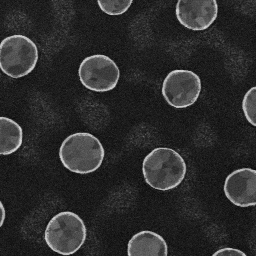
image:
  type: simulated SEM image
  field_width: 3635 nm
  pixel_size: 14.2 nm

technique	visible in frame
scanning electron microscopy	raised bodies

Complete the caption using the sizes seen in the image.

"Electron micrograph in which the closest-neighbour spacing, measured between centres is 1160 nm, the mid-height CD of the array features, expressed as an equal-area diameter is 565 nm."